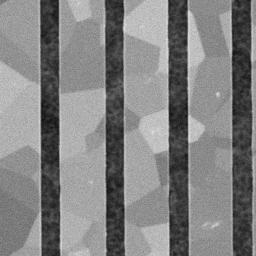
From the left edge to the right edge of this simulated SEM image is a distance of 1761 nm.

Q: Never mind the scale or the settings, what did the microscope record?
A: one or a few lines or trenches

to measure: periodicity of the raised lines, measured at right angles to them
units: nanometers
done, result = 439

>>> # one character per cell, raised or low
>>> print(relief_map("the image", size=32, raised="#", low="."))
#####..######...#####..######..#
#####...#####...#####...#####..#
#####...#####...#####...#####..#
#####...#####...#####...#####..#
#####...#####...#####...#####..#
#####...#####...#####...#####..#
#####...#####...#####...#####...
#####...#####...#####...#####...
#####...#####...#####...#####...
#####..######...#####...#####...
#####..######...#####...#####...
#####...#####...#####...#####...
#####...#####...#####...#####...
#####..######...######..#####...
#####...#####...#####...#####...
#####...#####...#####...#####...
#####...#####...#####...#####...
#####...#####...#####...#####...
#####..######...#####...#####...
#####...#####...#####...#####...
#####...#####.#.#####...#####...
#####.#######...#####...######..
#####..######...#####...#####...
#####..######...#####...#####...
#####...#####...#####...#####...
#####...#####...#####..######...
#####...#####...#####..######...
#####..######...#####...#####...
#####...#####...#####..######...
#####...#####...#####...#####...
#####...#####...#####...#####...
#####...#####...#####...#####...